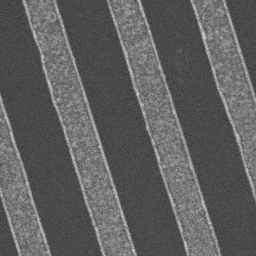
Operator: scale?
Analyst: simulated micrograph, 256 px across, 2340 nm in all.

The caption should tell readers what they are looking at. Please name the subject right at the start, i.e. one or a few lines or trenches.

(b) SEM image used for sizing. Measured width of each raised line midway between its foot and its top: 30.6 px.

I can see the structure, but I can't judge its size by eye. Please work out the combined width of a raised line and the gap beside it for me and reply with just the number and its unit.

738 nm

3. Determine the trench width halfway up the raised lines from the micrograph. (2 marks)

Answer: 0.455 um